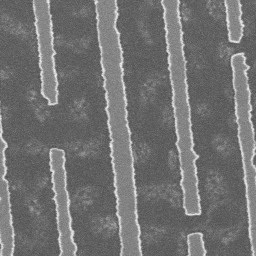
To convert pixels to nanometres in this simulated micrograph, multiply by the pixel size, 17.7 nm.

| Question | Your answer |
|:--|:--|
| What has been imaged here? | one or a few lines or trenches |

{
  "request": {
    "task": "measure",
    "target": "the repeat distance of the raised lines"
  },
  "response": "1130 nm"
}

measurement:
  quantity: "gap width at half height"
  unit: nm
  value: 835